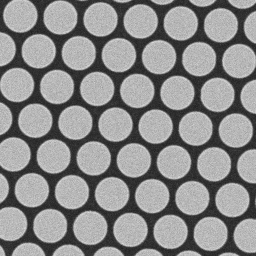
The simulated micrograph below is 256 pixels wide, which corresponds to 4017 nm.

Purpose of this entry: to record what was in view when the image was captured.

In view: an array of small figures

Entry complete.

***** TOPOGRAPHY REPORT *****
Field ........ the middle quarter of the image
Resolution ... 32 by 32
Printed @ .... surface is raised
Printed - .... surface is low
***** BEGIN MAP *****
-@@@@@----@@@@@@@---@@@@@@@---@@
------------@@@@-----@@@@@@----@
@-----@@@@----------------------
@@---@@@@@@-----@@@@@-----@@@@--
@@--@@@@@@@@---@@@@@@@---@@@@@@@
@@--@@@@@@@@--@@@@@@@@---@@@@@@@
@@--@@@@@@@@--@@@@@@@@--@@@@@@@@
@@--@@@@@@@@--@@@@@@@@--@@@@@@@@
@----@@@@@@@---@@@@@@@--@@@@@@@@
------@@@@@----@@@@@@----@@@@@@@
----------------@@@@------@@@@@-
@@@@@@-----@@@@-----------------
@@@@@@----@@@@@@----@@@@@@-----@
@@@@@@@--@@@@@@@@--@@@@@@@----@@
@@@@@@@--@@@@@@@@--@@@@@@@@--@@@
@@@@@@@--@@@@@@@@--@@@@@@@@--@@@
@@@@@@@--@@@@@@@@--@@@@@@@@--@@@
@@@@@@---@@@@@@@---@@@@@@@@--@@@
-@@@------@@@@@-----@@@@@@----@@
-------@@------------@@@------@@
@----@@@@@-----@@@@@-------@@---
@---@@@@@@@---@@@@@@@----@@@@@--
@--@@@@@@@@---@@@@@@@---@@@@@@@-
@--@@@@@@@@@-@@@@@@@@@-@@@@@@@@@
@--@@@@@@@@--@@@@@@@@@-@@@@@@@@@
@---@@@@@@@--@@@@@@@@--@@@@@@@@@
----@@@@@@----@@@@@@@---@@@@@@@-
------@@@------@@@@@-----@@@@@@-
@@@@-------@@-------------@@@---
@@@@@----@@@@@@-----@@@@--------
@@@@@@--@@@@@@@@---@@@@@@----@@@
@@@@@@--@@@@@@@@--@@@@@@@@---@@@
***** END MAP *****